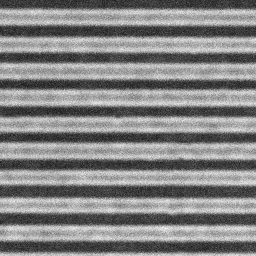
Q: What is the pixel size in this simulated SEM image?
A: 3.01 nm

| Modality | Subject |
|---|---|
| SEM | parallel lines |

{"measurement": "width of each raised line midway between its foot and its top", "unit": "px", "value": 11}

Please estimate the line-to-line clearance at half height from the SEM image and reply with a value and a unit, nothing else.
47.8 nm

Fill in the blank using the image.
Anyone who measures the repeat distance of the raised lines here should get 81.3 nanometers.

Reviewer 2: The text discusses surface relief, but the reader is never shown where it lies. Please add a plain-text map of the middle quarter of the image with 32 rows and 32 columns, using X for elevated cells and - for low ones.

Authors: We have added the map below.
--------------------------------
XXXXXXXXXXXXXXXXXXXXXXXXXXXXXXXX
XXXXXXXXXXXXXXXXXXXXXXXXXXXXXXXX
--------------------------------
--------------------------------
--------------------------------
--------------------------------
XXXXXXXXXXXXXXXXXXXXXXXXXXXXXXXX
XXXXXXXXXXXXXXXXXXXXXXXXXXXXXXXX
XXXXXXXXXXXXXXXXXXXXXXXXXXXXXXXX
--------------------------------
--------------------------------
--------------------------------
--------------------------------
XXXXXXXXXXXXXXXXXXXXXXXXXXXXXXXX
XXXXXXXXXXXXXXXXXXXXXXXXXXXXXXXX
---------------XXXXXXXXXXXXXXXXX
--------------------------------
--------------------------------
--------------------------------
XXXXXXXXXXXXXXXXXXXXXXXX--------
XXXXXXXXXXXXXXXXXXXXXXXXXXXXXXXX
XXXXXXXXXXXXXXXXXXXXXXXXXXXXXXXX
--------------------------------
--------------------------------
--------------------------------
--------------------------------
XXXXXXXXXXXXXXXXXXXXXXXXXXXXXXXX
XXXXXXXXXXXXXXXXXXXXXXXXXXXXXXXX
XXXXXXXXXXXXXXXXXXXXXXXXXXXXXXXX
--------------------------------
--------------------------------